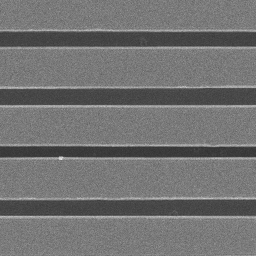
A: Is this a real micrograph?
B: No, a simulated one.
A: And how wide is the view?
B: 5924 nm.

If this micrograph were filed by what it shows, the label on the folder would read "lines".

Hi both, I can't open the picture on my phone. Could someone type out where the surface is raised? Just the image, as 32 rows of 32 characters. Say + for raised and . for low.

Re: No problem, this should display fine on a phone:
++++++++++++++++++++++++++++++++
++++++++++++++++++++++++++++++++
++++++++++++++++++++++++++++++++
++++++++++++++++++++++++++++++++
................................
................................
++++++++++++++++++++++++++++++++
++++++++++++++++++++++++++++++++
++++++++++++++++++++++++++++++++
++++++++++++++++++++++++++++++++
++++++++++++++++++++++++++++++++
................................
................................
++++++++++++++++++++++++++++++++
++++++++++++++++++++++++++++++++
++++++++++++++++++++++++++++++++
++++++++++++++++++++++++++++++++
++++++++++++++++++++++++++++++++
................................
................................
++++++++++++++++++++++++++++++++
++++++++++++++++++++++++++++++++
++++++++++++++++++++++++++++++++
++++++++++++++++++++++++++++++++
++++++++++++++++++++++++++++++++
................................
................................
++++++++++++++++++++++++++++++++
++++++++++++++++++++++++++++++++
++++++++++++++++++++++++++++++++
++++++++++++++++++++++++++++++++
++++++++++++++++++++++++++++++++